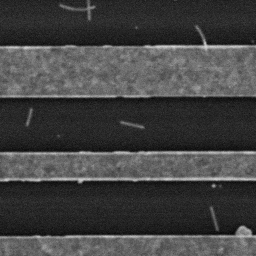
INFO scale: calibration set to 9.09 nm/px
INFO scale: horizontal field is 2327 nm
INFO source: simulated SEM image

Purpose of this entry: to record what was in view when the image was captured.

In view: lines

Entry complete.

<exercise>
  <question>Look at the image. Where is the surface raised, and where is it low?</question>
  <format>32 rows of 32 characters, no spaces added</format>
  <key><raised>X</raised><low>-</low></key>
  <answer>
--------------------------------
--------------------------------
--------------------------------
--------------------------------
--------------------------------
--------------------------------
XXXXXXXXXXXXXXXXXXXXXXXXXXXXXXXX
XXXXXXXXXXXXXXXXXXXXXXXXXXXXXXXX
XXXXXXXXXXXXXXXXXXXXXXXXXXXXXXXX
XXXXXXXXXXXXXXXXXXXXXXXXXXXXXXXX
XXXXXXXXXXXXXXXXXXXXXXXXXXXXXXXX
XXXXXXXXXXXXXXXXXXXXXXXXXXXXXXXX
--------------------------------
--------------------------------
--------------------------------
--------------------------------
--------------------------------
--------------------------------
--------------------------------
XXXXXXXXXXXXXXXXXXXXXXXXXXXXXXXX
XXXXXXXXXXXXXXXXXXXXXXXXXXXXXXXX
XXXXXXXXXXXXXXXXXXXXXXXXXXXXXXXX
--------------------------------
--------------------------------
--------------------------------
--------------------------------
--------------------------------
--------------------------------
--------------------------------
--------------------------------
XXXXXXXXXXXXXXXXXXXXXXXXXXXXXXXX
XXXXXXXXXXXXXXXXXXXXXXXXXXXXXXXX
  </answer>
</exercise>